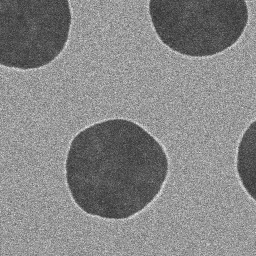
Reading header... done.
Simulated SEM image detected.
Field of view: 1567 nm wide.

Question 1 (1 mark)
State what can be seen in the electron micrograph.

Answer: holes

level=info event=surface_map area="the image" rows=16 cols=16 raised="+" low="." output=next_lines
....+++++......+
....++++++.....+
....++++++.....+
....++++++++.+++
++++++++++++++++
++++++++++++++++
++++++++++++++++
+++++++.++++++++
+++++....++++++.
++++......+++++.
++++......+++++.
++++......+++++.
+++++.....++++++
++++++..++++++++
++++++++++++++++
++++++++++++++++